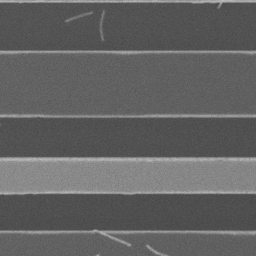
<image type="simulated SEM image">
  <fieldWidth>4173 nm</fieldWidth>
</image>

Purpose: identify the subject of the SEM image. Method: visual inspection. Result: lines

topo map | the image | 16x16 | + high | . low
................
................
................
++++++++++++++++
++++++++++++++++
++++++++++++++++
++++++++++++++++
................
................
................
++++++++++++++++
++++++++++++++++
................
................
++++++++++++++++
++++++++++++++++